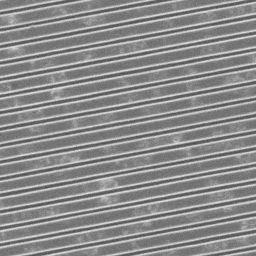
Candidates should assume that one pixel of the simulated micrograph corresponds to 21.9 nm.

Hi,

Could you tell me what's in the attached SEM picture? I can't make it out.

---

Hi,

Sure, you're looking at parallel lines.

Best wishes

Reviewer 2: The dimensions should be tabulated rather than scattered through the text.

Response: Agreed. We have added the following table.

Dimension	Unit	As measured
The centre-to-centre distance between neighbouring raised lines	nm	356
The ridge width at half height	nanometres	253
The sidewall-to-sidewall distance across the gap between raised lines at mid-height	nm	105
